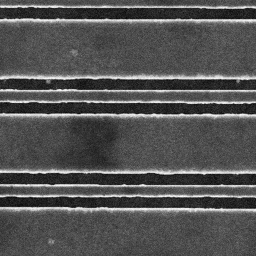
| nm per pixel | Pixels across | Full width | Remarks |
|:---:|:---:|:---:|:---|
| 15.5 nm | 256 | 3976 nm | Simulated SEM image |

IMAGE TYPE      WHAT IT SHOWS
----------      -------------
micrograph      lines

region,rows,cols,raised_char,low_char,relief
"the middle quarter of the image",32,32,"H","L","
HHHHHHHHHHHHHHHHHHHHHHHHHHHHHHHH
HHHHHHHHHHHHHHHHHHHHHHHHHHHHHHHH
HHHHHHHHHHHHHHHHHHHHHHHHHHHHHHHH
HHHLLLLHLLLLLLHHHHLHHHHHHHHLHHHH
LLLLLLLLLLLLLLLLLLLLLLLLLLLLLLLL
LLLLLLLLLLLLLLLLLLLLLLLLLLLLLLLL
HHHHLLLLLLHLLLLLLLLLLLLLLLLLLLLL
HHHHHHHHHHHHHHHHHHHHHHHHHHHHHHHH
HHHHHHHHHHHHHHHHHHHHHHHHHHHHHHHH
LLLLLHHHHHHHHHHHHHHHHHHHHHHHHHHH
LLLLLLLLLLLLLLLLLLLLLLLLLLLLLLLL
LLLLLLLLLLLLLLLLLLLLLLLLLLLLLLLL
LLLLLLLLLLLLLLLLLLLLLLLLLLLLLLLL
HHHHHHHHHHHHHHHHHHHHHHHHHHHHHHHH
HHHHHHHHHHHHHHHHHHHHHHHHHHHHHHHH
HHHHHHHHHHHHHHHHHHHHHHHHHHHHHHHH
HHHHHHHHHHHHHHHHHHHHHHHHHHHHHHHH
HHHHHHHHHHHHHHHHHHHHHHHHHHHHHHHH
HHHHHHHHHHHHHHHHHHHHHHHHHHHHHHHH
HHHHHHHHHHHHHHHHHHHHHHHHHHHHHHHH
HHHHHHHHHHHHHHHHHHHHHHHHHHHHHHHH
HHHHHHHHHHHHHHHHHHHHHHHHHHHHHHHH
HHHHHHHHHHHHHHHHHHHHHHHHHHHHHHHH
HHHHHHHHHHHHHHHHHHHHHHHHHHHHHHHH
HHHHHHHHHHHHHHHHHHHHHHHHHHHHHHHH
HHHHHHHHHHHHHHHHHHHHHHHHHHHHHHHH
HHHHHHHHHHHHHHHHHHHHHHHHHHHHHHHH
LLLLLLLLLLLLLLLLLLLLLLLLLLLLLLLL
LLLLLLLLLLLLLLLLLLLLLLLLLLLLLLLL
LLLLLLLLLLLLLLLLLLLLLLLLLLLLLLLL
HHHHHHHHHHHHHHHHHHHHHHHHHHHHHHHH
HHHHHHHHHHHHHHHHHHHHHHHHHHHHHHHH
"